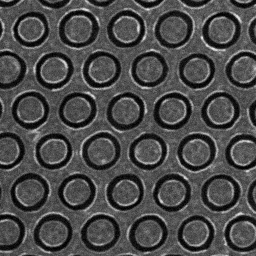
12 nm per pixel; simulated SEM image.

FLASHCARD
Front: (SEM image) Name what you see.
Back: a regular array of ring-shaped grooves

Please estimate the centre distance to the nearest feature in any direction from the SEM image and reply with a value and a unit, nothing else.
557 nanometers